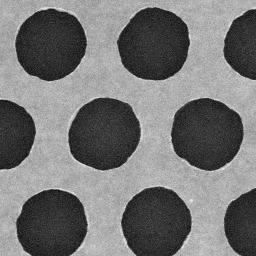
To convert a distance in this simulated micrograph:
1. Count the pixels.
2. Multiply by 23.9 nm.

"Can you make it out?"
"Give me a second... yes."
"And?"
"holes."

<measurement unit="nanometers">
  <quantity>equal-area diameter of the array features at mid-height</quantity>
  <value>1730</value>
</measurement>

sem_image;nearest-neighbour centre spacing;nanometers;2450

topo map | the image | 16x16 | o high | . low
ooooooooo.oooooo
o....ooo....oo..
o....oo.....oo..
o....oo.....oo..
oo..oooo...oooo.
oooooooooooooooo
.oooo...oooo..oo
..oo.....oo....o
..oo.....oo....o
..oo....ooo....o
.ooooo.ooooo..oo
oooooooooooooooo
oo...ooo...oooo.
o....ooo....oo..
o....ooo....oo..
o....ooo...oooo.